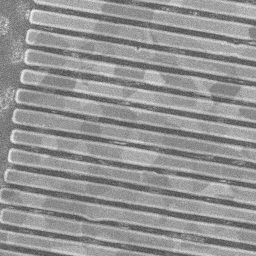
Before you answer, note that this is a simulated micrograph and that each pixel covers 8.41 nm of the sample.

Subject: parallel lines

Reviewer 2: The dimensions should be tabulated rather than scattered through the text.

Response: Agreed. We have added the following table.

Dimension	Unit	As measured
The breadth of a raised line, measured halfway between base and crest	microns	0.0995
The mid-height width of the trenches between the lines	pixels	8.5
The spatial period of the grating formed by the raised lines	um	0.17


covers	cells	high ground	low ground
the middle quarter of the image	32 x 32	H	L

HHHHHHHHHHHHLLLLLLLLLLLLLLLHHHHH
LLLHHHHHHHHHHHHHHHLLLLLLLLLLLLLL
LLLLLLLLLHHHHHHHHHHHHHHHHLLLLLLL
LLLLLLLLLLLLLLLHHHHHHHHHHHHHHHHH
HHHHHHLLLLLLLLLLLLLLLHHHHHHHHHHH
HHHHHHHHHHHHLLLLLLLLLLLLLLHHHHHH
LLHHHHHHHHHHHHHHHHLLLLLLLLLLLLLL
LLLLLLLLHHHHHHHHHHHHHHHHLLLLLLLL
HLLLLLLLLLLLLLHHHHHHHHHHHHHHHHLL
HHHHHHHLLLLLLLLLLLLLHHHHHHHHHHHH
HHHHHHHHHHHHHLLLLLLLLLLLLHHHHHHH
HLHHHHHHHHHHHHHHHHHLLLLLLLLLLLLL
LLLLLLHHHHHHHHHHHHHHHHHLLLLLLLLL
HLLLLLLLLLLLHHHHHHHHHHHHHHHHHLLL
HHHHHHLLLLLLLLLLLLLHHHHHHHHHHHHH
HHHHHHHHHHHHLLLLLLLLLLLLLHHHHHHH
LHHHHHHHHHHHHHHHHHLLLLLLLLLLLLLH
LLLLLLLHHHHHHHHHHHHHHHHHLLLLLLLL
LLLLLLLLLLLLHHHHHHHHHHHHHHHHHHLL
HHHHHHLLLLLLLLLLLLHHHHHHHHHHHHHH
HHHHHHHHHHHHLLLLLLLLLLLLHHHHHHHH
HHHHHHHHHHHHHHHHHHLLLLLLLLLLLLHH
LLLLLLHHHHHHHHHHHHHHHHHLLLLLLLLL
LLLLLLLLLLHHHHHHHHHHHHHHHHHHHLLL
HHHLLLLLLLLLLLLLHHHHHHHHHHHHHHHH
HHHHHHHHHLLLLLLLLLLLLLLHHHHHHHHH
HHHHHHHHHHHHHHHHLLLLLLLLLLLLLLLH
LLLLLLHHHHHHHHHHHHHHHHHLLLLLLLLL
LLLLLLLLLLLLHHHHHHHHHHHHHHHHHLLL
HHHHLLLLLLLLLLLLLLHHHHHHHHHHHHHH
HHHHHHHHHHLLLLLLLLLLLLHHHHHHHHHH
HHHHHHHHHHHHHHHHLLLLLLLLLLLLHHHH